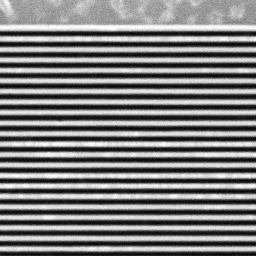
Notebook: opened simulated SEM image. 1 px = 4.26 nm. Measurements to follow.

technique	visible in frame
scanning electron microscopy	parallel lines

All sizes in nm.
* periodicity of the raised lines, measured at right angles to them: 44.6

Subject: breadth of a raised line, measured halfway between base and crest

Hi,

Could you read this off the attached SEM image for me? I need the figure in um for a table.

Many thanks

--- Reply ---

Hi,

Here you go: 0.0197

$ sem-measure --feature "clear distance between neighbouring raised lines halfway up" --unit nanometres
23.4